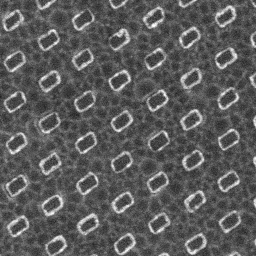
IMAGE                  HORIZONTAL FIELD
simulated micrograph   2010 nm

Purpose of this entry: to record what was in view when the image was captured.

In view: a regular array of raised bodies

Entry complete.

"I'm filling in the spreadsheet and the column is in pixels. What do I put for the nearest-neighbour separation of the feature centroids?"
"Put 40.2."